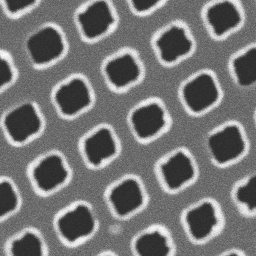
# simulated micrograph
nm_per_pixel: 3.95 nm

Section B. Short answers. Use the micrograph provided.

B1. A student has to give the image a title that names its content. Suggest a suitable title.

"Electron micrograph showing a regular array of holes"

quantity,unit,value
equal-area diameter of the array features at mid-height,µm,0.127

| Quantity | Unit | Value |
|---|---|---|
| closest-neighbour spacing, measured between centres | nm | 220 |